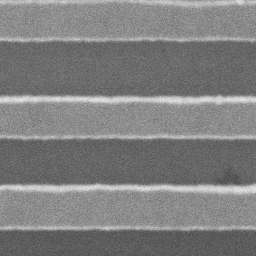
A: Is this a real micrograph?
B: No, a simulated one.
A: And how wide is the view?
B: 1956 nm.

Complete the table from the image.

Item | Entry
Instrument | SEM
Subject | lines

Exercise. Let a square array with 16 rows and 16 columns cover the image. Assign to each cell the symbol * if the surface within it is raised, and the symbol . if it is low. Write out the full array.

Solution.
****************
****************
***.***....*...*
................
................
................
****************
****************
****************
................
................
................
****************
****************
................
................